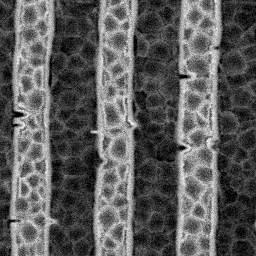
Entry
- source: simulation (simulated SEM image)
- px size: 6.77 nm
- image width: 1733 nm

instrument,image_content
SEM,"one or a few lines or trenches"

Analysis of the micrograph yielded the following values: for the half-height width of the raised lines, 0.229 microns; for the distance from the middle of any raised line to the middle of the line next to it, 562 nm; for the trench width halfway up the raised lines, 0.337 µm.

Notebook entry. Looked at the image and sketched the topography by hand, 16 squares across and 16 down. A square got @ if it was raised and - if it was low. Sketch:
-@@---@@---@@@--
-@@---@@---@@@--
-@@---@@---@@@--
-@@---@@---@@@--
-@@---@@---@@---
-@@---@@---@@---
-@@---@@---@@---
-@@---@@---@@---
-@@---@@---@@---
-@@---@@---@@---
-@@---@@---@@---
-@@---@@---@@---
-@@---@@---@@---
-@@---@@---@@---
-@@---@@---@@---
-@@---@@---@@---